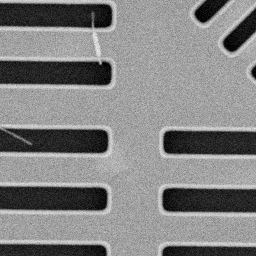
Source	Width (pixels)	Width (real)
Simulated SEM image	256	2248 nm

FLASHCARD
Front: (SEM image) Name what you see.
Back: groups of lines, slits or small figures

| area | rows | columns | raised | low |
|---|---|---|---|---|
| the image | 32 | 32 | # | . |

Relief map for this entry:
..............###########...####
..............##########...####.
..............##########..####..
..............###############...
############################....
############################...#
############################..##
............####################
..............#################.
..............#################.
..............##################
################################
################################
################################
################################
################################
..............#######...........
..............######............
..............######............
########################........
################################
################################
################################
.............########...........
..............######............
..............######............
#............########...........
################################
################################
################################
.............########.......####
..............######............